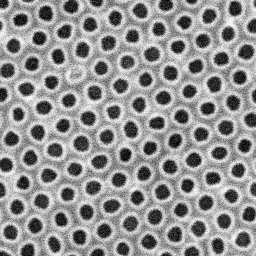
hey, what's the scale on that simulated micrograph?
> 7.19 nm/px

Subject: a regular array of holes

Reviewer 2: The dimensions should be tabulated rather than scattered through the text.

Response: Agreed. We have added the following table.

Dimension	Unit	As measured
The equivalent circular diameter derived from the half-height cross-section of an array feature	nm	111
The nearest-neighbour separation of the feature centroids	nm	182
